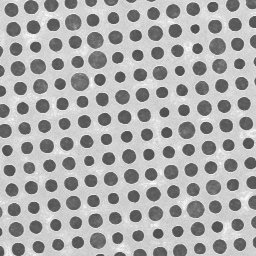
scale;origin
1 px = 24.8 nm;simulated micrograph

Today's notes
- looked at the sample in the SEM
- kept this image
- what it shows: a regular array of holes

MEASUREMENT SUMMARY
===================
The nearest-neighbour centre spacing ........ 488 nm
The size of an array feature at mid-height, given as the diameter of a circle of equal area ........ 328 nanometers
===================